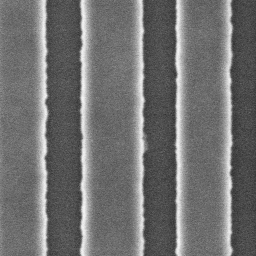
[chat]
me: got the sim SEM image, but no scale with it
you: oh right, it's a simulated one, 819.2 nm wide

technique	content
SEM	lines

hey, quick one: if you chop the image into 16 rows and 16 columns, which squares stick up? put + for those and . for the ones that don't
+++..++++..+++..
+++..++++..+++..
+++..++++..+++..
+++..++++..+++..
+++..++++..+++..
+++..++++..+++..
+++..++++..+++..
+++..++++..+++..
+++..++++..+++..
+++..++++..+++..
+++..++++..+++..
+++..++++..+++..
+++..++++..+++..
+++..++++..+++..
+++..++++..+++..
+++..++++..+++..